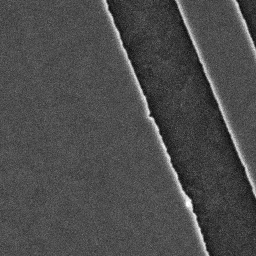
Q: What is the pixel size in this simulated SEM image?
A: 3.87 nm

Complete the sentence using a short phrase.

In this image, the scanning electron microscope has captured one or a few lines or trenches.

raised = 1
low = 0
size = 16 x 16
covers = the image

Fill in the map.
1111111000011110
1111111000001110
1111111100001111
1111111100001111
1111111100000111
1111111110000111
1111111110000011
1111111111000011
1111111111000011
1111111111000001
1111111111100001
1111111111100000
1111111111110000
1111111111110000
1111111111111000
1111111111111000